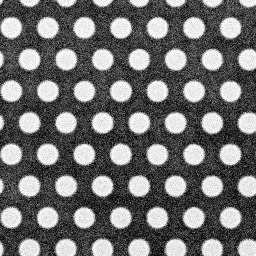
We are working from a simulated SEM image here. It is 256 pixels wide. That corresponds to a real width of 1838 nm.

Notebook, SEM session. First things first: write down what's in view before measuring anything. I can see an array of small figures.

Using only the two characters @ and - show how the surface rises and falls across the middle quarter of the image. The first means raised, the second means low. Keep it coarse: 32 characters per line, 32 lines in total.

@@------@@@------@@@@-----@@@@--
--------------------------------
--------------------------------
--------------------------------
--------------@--------@--------
---@@@@-----@@@@-----@@@@-----@@
---@@@@-----@@@@@----@@@@@----@@
---@@@@-----@@@@@----@@@@@----@@
---@@@@------@@@------@@@------@
--------------------------------
--------------------------------
--------------------------------
@--------@@-------@@-------@@---
@@------@@@@-----@@@@-----@@@@--
@@@----@@@@@-----@@@@-----@@@@--
@@@----@@@@@-----@@@@-----@@@@--
@@------@@@------@@@------@@@@--
--------------------------------
--------------------------------
--------------------------------
----@@-------@@-------@@--------
---@@@@-----@@@@-----@@@@-----@@
---@@@@-----@@@@@----@@@@@----@@
---@@@@-----@@@@-----@@@@@----@@
----@@@------@@@------@@@------@
--------------------------------
--------------------------------
--------------------------------
@@------@@@-------@@-------@@---
@@@----@@@@@-----@@@@-----@@@@--
@@@----@@@@@-----@@@@-----@@@@--
@@@----@@@@@-----@@@@-----@@@@--